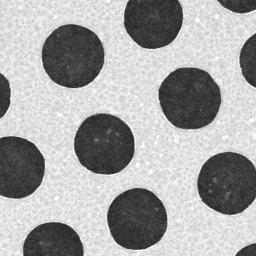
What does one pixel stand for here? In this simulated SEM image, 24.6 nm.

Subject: holes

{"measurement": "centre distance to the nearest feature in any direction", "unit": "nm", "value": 2160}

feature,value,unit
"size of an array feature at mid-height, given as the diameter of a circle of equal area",1520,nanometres